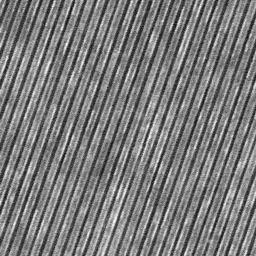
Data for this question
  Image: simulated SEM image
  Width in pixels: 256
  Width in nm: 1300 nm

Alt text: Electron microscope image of parallel lines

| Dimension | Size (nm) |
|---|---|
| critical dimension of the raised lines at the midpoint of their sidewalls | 34.8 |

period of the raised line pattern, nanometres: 52.5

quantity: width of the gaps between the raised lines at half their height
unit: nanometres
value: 19.2